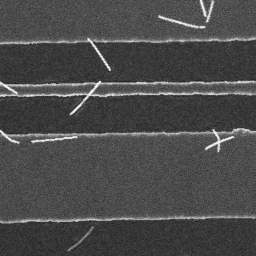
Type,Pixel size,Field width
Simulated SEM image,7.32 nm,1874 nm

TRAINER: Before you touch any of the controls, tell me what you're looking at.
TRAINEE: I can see lines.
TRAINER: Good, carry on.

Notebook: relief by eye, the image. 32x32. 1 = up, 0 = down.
11111111111111111111111111111111
11111111111111111111111111111111
11111111111111111111111111111111
11111111111111111111111111111111
11111111111111111111111111111111
00000000000000000000000000000000
00000000000000000000000000000000
00000000000000000000000000000000
00000000000000000000000000000000
00000000000000000000000000000000
10000000001111111111111111111111
11111111111111111111111111111111
00000000000000000000000000000000
00000000000000000000000000000000
00000000000000000000000000000000
00000000000000000000000000000000
00000000000000000000000000000111
11111111111111111111111111111111
11111111111111111111111111111111
11111111111111111111111111111111
11111111111111111111111111111111
11111111111111111111111111111111
11111111111111111111111111111111
11111111111111111111111111111111
11111111111111111111111111111111
11111111111111111111111111111111
11111111111111111111111111111111
11111111111010000000000000000000
00000000000000000000000000000000
00000000000000000000000000000000
00000000000000000000000000000000
00000000000000000000000000000000